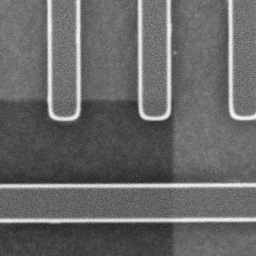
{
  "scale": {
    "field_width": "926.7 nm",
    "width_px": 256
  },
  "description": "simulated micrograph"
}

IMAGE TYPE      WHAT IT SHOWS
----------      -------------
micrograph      groups of lines, slits or small figures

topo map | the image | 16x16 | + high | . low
...++....++...++
...++....++...++
...++....++...++
...++....++...++
...++....++...++
...++....++...++
...++....++...++
................
................
................
................
................
++++++++++++++++
++++++++++++++++
................
................